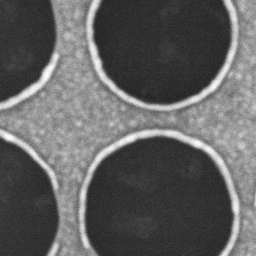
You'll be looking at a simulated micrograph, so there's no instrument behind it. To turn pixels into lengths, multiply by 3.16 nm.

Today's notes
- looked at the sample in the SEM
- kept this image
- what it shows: holes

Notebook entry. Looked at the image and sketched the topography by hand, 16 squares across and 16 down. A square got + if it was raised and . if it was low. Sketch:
...+++........++
....++.........+
....++........++
...+++........++
...++++.......++
..+++++......+++
+++++++++..+++++
++++++++++++++++
++++++++++++++++
..+++++......+++
...+++........++
...+++........++
....+..........+
....+..........+
....+.........++
...+++........++